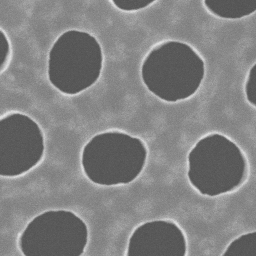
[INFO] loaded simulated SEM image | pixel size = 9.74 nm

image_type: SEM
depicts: holes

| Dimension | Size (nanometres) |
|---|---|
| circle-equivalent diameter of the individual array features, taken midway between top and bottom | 579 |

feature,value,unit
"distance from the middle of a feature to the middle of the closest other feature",982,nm